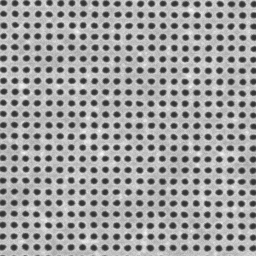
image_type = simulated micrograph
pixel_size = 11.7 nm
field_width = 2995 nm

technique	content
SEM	a regular array of holes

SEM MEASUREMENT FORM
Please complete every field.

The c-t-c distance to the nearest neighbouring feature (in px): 10.8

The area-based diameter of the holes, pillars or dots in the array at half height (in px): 7.14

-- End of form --